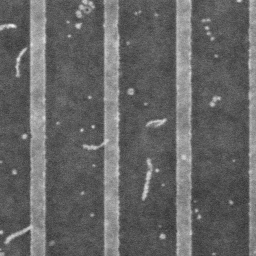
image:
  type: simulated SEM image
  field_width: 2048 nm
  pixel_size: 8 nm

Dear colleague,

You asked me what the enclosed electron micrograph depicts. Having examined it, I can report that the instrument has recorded lines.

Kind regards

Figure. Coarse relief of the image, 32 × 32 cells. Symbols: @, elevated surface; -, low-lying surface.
----@@-------@@-------@@-------@
----@@-------@@-------@@-------@
----@@-------@@-------@@-------@
----@@-------@@-------@@-------@
----@@-------@@-------@@-------@
----@@-------@@-------@@-------@
----@@-------@@-------@@-------@
----@@-------@@-------@@-------@
----@@-------@@-------@@-------@
----@@-------@@-------@@-------@
----@@-------@@-------@@-------@
----@@-------@@-------@@-------@
----@@-------@@-------@@-------@
----@@-------@@-------@@-------@
----@@-------@@-------@@-------@
----@@-------@@-------@@-------@
----@@-------@@-------@@-------@
----@@-------@@-------@@-------@
----@@-------@@-------@@-------@
----@@-------@@-------@@-------@
----@@-------@@-------@@-------@
----@@-------@@-------@@-------@
----@@-------@@-------@@-------@
----@@-------@@-------@@-------@
----@@-------@@-------@@-------@
----@@-------@@-------@@-------@
----@@-------@@-------@@-------@
----@@-------@@-------@@-------@
----@@-------@@-------@@-------@
----@@-------@@-------@@-------@
----@@-------@@-------@@-------@
----@@-------@@-------@@-------@